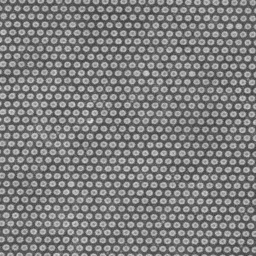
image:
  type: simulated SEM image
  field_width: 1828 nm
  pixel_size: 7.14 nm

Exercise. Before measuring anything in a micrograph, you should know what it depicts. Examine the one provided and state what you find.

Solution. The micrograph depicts a regular array of raised bodies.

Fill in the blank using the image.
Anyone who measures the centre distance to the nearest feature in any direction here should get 64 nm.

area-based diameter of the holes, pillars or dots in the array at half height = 0.0418 micrometres